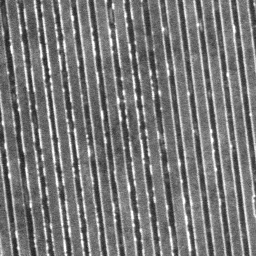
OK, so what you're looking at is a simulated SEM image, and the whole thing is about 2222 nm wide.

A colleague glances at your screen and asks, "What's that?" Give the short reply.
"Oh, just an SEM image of parallel lines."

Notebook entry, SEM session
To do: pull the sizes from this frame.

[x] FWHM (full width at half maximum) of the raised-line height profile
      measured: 94.8 nm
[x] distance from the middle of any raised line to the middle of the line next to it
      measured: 153 nanometres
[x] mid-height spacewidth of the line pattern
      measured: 58.1 nanometres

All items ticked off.